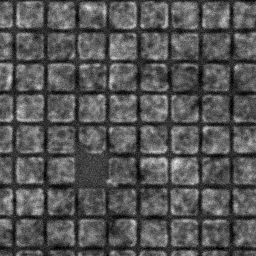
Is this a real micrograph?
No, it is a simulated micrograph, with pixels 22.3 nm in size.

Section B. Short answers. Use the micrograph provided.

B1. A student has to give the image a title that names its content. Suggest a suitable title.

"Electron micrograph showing a regular array of raised bodies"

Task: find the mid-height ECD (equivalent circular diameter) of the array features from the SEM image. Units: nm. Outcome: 635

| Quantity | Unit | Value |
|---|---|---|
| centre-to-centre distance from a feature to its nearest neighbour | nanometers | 681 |